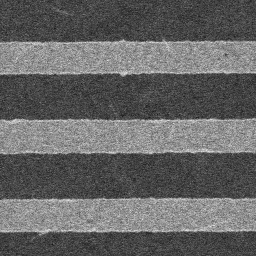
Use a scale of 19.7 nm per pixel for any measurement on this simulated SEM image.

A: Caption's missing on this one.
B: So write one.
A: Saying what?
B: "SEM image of one or a few lines or trenches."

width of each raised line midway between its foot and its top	0.61	µm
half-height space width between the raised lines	929	nm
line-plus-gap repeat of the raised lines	1.55	µm